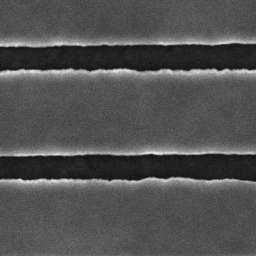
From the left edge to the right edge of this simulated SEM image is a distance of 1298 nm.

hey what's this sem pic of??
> lines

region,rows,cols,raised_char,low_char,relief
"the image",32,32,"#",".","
################################
################################
################################
################################
################################
############################....
................................
................................
................................
################################
################################
################################
################################
################################
################################
################################
################################
################################
################################
................................
................................
................................
###.#########.##.#############..
################################
################################
################################
################################
################################
################################
################################
################################
################################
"